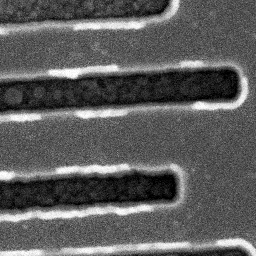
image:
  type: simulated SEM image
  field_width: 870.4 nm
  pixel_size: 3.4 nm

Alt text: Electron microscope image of one or a few lines or trenches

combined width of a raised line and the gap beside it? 312 nm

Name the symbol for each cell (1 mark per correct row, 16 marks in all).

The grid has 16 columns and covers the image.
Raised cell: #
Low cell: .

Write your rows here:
...........#####
..##############
################
################
########.......#
...............#
............####
################
################
################
################
...........#####
...........#####
################
################
#############..#